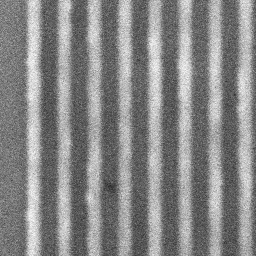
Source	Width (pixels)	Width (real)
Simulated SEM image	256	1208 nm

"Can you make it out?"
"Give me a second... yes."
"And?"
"parallel lines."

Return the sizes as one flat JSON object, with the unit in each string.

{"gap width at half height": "98 nanometers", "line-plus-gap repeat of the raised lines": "143 nanometers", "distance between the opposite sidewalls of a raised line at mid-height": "0.0431 microns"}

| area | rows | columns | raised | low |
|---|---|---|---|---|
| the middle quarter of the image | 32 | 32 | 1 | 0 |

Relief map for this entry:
10000001100000110000001100000110
10000001100000110000001100000110
10000001100000110000001100000110
10000001100000110000001100000110
10000001100000110000001100000110
10000011100000110000001100000110
10000011100000110000001100000110
10000011100000110000001100000110
10000001100000110000001100000110
10000001100000110000001100000110
10000001100000110000001100000110
10000001100000110000001100000110
10000001100000110000001100000110
10000001100000110000001100000110
10000001100000110000001100000110
10000001100000110000001100000110
10000001100000110000001100000110
10000001100000110000001100000110
10000001100000110000001100000110
11000001100000110000001100000110
10000001100000110000001100000110
10000001100000110000001100000110
10000001100000110000001100000110
10000011100000110000001100000110
10000011100000110000001100000110
10000011100000110000001100000110
10000011100000110000001100000110
10000011100000110000001100000110
10000011100000110000001100000110
10000011100000110000001100000110
10000011100000110000001100000110
10000011100000110000001100000110